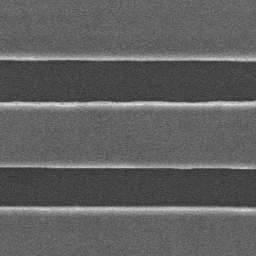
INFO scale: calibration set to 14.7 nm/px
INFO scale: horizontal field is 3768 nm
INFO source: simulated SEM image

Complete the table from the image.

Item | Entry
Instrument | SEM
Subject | lines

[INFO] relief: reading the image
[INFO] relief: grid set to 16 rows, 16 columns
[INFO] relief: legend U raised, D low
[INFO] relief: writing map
UUUUUUUUUUUUUUUU
UUUUUUUUUUUUUUUU
UUUUUUUUUUUUUUUU
UUUUUUUUUUUUUUUU
DDDDDDDDDDDDDDDD
DDDDDDDDDDDDDDDD
DDDDDDDDUUUDDUUU
UUUUUUUUUUUUUUUU
UUUUUUUUUUUUUUUU
UUUUUUUUUUUUUUUU
DDDDDDDDDDDDDDUU
DDDDDDDDDDDDDDDD
DDDDDDDDDDDDDDDD
UUUUUUUUUUUUUUUU
UUUUUUUUUUUUUUUU
UUUUUUUUUUUUUUUU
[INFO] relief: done